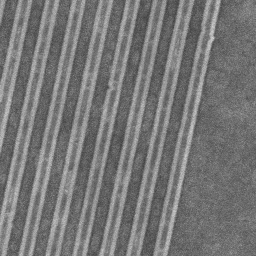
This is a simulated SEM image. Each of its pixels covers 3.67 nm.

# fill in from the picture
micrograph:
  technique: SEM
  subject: parallel lines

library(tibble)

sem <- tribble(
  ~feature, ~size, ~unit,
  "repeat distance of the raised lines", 96.6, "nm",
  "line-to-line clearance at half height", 59.7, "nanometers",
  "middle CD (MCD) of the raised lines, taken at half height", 36.3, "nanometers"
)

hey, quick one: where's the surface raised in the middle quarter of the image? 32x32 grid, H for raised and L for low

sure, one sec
HHLLLLHHLLLLLHHLLLLHHHLLLLHHLLLL
HLLLLLHHLLLLHHHLLLLHHHLLLLHHLLLL
HLLLLHHHLLLLHHHLLLLHHLLLLLHHLLLL
HLLLLHHHLLLLHHLLLLLHHLLLLHHHLLLL
HLLLLHHHLLLLHHLLLLHHHLLLLHHHLLLL
LLLLLHHLLLLLHHLLLLHHHLLLLHHHLLLL
LLLLLHHLLLLHHHLLLLHHLLLLLHHLLLLH
LLLLHHHLLLLHHHLLLLHHLLLLLHHLLLLH
LLLLHHHLLLLHHLLLLLHHLLLLHHHLLLLH
LLLLHHHLLLLHHLLLLHHHLLLLHHHLLLLH
LLLLHHLLLLLHHLLLLHHHLLLLHHLLLLLH
LLLHHHLLLLHHHLLLLHHLLLLLHHLLLLHH
LLLHHHLLLLHHHLLLLHHLLLLHHHLLLLHH
LLLHHHLLLLHHLLLLLHHLLLLHHHLLLLHH
LLLHHLLLLLHHLLLLHHHLLLLHHHLLLLHH
LLLHHLLLLHHHLLLLHHHLLLLHHLLLLLHH
LLHHHLLLLHHHLLLLHHLLLLLHHLLLLHHH
LLHHHLLLLHHHLLLLHHLLLLHHHLLLLHHH
LLHHHLLLLHHLLLLLHHLLLLHHHLLLLHHH
LLHHLLLLHHHLLLLHHHLLLLHHLLLLLHHL
LLHHLLLLHHHLLLLHHHLLLLHHLLLLHHHL
LHHHLLLLHHHLLLLHHLLLLLHHLLLLHHHL
LHHHLLLLHHLLLLLHHLLLLHHHLLLLHHHL
LHHHLLLLHHLLLLHHHLLLLHHHLLLLHHHL
LHHLLLLLHHLLLLHHHLLLLHHLLLLLHHLL
HHHLLLLHHHLLLLHHHLLLLHHLLLLHHHLL
HHHLLLLHHHLLLLHHLLLLLHHLLLLHHHLL
HHHLLLLHHLLLLLHHLLLLHHHLLLLHHHLL
HHHLLLLHHLLLLHHHLLLLHHHLLLLHHLLL
HHLLLLLHHLLLLHHHLLLLHHHLLLLHHLLL
HHLLLLHHHLLLLHHLLLLLHHLLLLHHHLLL
HHLLLLHHHLLLLHHLLLLHHHLLLLHHHLLL